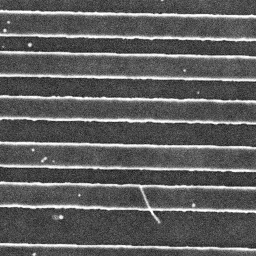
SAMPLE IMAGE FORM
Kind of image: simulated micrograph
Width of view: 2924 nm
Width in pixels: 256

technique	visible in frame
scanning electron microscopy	lines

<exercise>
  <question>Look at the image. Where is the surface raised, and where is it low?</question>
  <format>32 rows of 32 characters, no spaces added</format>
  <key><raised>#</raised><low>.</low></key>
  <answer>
................................
###.............................
################################
################################
.....##.########################
................................
#...............................
################################
################################
################################
................................
................................
########################.#......
################################
################################
................................
................................
................................
################################
################################
################################
................................
................................
################################
################################
################################
................................
................................
................................
................................
................................
################################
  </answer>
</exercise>